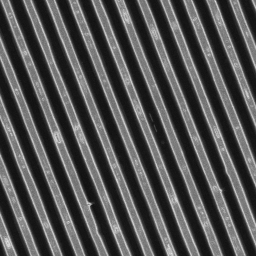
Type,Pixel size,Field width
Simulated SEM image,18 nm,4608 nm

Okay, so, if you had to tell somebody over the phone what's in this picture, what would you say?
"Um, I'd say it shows parallel lines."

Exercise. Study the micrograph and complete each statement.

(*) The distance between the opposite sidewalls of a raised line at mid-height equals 187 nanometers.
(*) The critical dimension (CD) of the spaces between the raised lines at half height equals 187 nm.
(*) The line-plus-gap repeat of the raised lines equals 21.4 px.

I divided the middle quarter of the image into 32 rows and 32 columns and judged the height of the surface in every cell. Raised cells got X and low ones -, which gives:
--XX---XXX---XXX---XX----XX---XX
--XXX---XX---XXX---XXX---XXX--XX
--XXX---XXX---XXX--XXX---XXX---X
---XX----XX---XXX---XXX---XX---X
---XXX---XXX--XXX---XXX---XXX---
---XXX---XXX---XXX---XX---XXX---
X---XXX---XX---XXX---XXX---XXX--
X---XXX---XXX---XXX--XXX---XXX--
XX---XXX--XXX---XXX---XXX---XX--
XX---XXX---XXX---XX---XXX---XXX-
XX---XXX---XXX---XXX---XX---XXX-
XXX---XXX---XX---XXX---XXX---XXX
XXX---XXX---XXX---XX---XXX---XXX
-XXX---XX---XXX---XXX---XX----XX
-XXX---XXX---XXX---XX---XXX---XX
--XXX--XXX---XXX---XX----XX---XX
--XXX---XX----XX---XXX---XXX---X
--XXX---XXX---XXX---XX---XXX---X
---XXX---XX---XXX---XXX---XX---X
---XXX---XXX---XX----XX---XXX---
X---XX---XXX---XXX---XXX--XXX---
X---XXX---XX---XXX---XXX---XXX--
X---XXX---XXX---XXX---XX---XXX--
XX---XXX--XXX---XXX---XXX---XX--
XX---XXX---XXX---XX---XXX---XXX-
XXX--XXX---XXX---XXX---XXX--XXX-
XXX---XXX---XX---XXX---XXX---XXX
XXX---XXX---XXX---XXX--XXX---XXX
-XXX---XXX--XXX---XXX---XXX---XX
-XXX---XXX---XXX---XXX--XXX---XX
--XXX---XX---XXX---XXX---XXX--XX
--XXX---XXX---XX---XXX---XXX---X